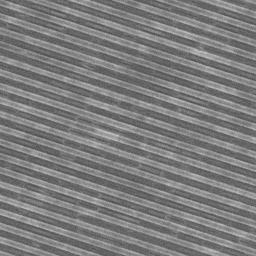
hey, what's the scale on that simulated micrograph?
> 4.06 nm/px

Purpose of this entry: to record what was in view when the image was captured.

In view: parallel lines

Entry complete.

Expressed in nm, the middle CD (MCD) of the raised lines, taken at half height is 25.6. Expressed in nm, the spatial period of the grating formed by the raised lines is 54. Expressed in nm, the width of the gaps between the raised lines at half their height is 29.